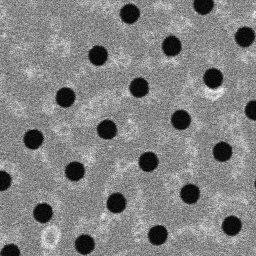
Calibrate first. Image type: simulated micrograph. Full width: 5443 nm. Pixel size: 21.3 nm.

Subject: a regular array of holes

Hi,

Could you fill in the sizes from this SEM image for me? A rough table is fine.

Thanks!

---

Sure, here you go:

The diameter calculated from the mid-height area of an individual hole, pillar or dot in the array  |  443 nm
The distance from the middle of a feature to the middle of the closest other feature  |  1.11 microns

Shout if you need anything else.